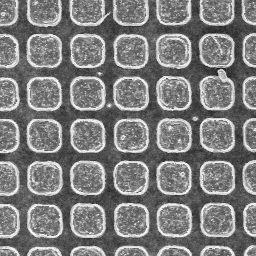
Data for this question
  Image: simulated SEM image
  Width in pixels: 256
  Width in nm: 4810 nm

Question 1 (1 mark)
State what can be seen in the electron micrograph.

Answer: a regular array of raised bodies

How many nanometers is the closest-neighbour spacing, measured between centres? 791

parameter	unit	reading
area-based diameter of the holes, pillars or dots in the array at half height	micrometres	0.645